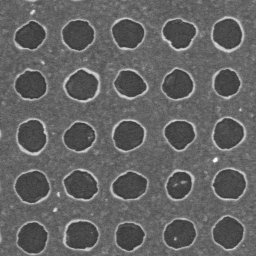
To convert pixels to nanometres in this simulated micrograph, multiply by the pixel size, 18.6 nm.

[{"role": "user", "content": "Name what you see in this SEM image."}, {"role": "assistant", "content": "a regular array of holes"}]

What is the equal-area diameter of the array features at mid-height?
571 nm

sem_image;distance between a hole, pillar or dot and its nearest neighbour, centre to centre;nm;902